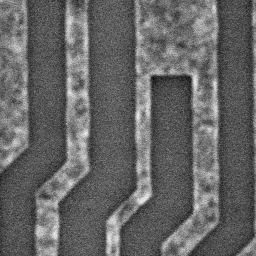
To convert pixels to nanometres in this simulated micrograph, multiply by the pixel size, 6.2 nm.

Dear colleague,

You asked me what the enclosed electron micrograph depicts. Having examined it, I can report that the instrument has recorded groups of lines, slits or small figures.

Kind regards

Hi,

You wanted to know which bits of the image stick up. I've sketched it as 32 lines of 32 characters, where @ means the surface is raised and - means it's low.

@@@-----@@@------@@@@@@@@@@-----
@@@-----@@@------@@@@@@@@@@-----
@@@-----@@@------@@@@@@@@@@-----
@@@-----@@@------@@@@@@@@@@-----
@@@-----@@@------@@@@@@@@@@-----
@@@-----@@@------@@@@@@@@@@-----
@@@-----@@@------@@@@@@@@@@-----
@@@-----@@@------@@@@@@@@@@-----
@@@-----@@@------@@@@@@@@@@-----
@@@-----@@@------@@-----@@@-----
@@@-----@@@------@@-----@@@-----
@@@-----@@@------@@-----@@@-----
@@@-----@@@------@@-----@@@-----
@@@-----@@@------@@-----@@@-----
@@@-----@@@------@@-----@@@-----
@@@-----@@@------@@-----@@@-----
@@@-----@@@------@@-----@@@-----
@@@-----@@@------@@-----@@@-----
@@@-----@@@------@@-----@@@-----
@@------@@@------@@-----@@@-----
@-------@@@------@@-----@@@-----
-------@@@@------@@-----@@@-----
------@@@@-------@@-----@@@-----
-----@@@@--------@@-----@@@-----
-----@@@--------@@@-----@@@-----
-----@@--------@@@------@@@-----
-----@@-------@@@-------@@@-----
-----@@-------@@-------@@@@-----
-----@@------@@-------@@@@@-----
-----@@------@@------@@@@-------
-----@@------@@-----@@@@-------@
-----@@------@@-----@@@@------@@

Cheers